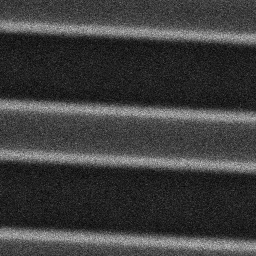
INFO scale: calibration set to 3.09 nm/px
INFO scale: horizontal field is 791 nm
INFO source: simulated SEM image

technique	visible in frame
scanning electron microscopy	one or a few lines or trenches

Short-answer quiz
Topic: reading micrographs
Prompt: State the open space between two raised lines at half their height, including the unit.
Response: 238 nanometres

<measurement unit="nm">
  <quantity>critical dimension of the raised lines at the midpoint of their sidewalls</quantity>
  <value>158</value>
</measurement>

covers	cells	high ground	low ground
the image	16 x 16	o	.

oooooooooooooooo
oooooooooooooooo
................
................
................
................
................
oooooooooooooooo
oooooooooooooooo
oooooooooooooooo
................
................
................
................
................
oooooooooooooooo